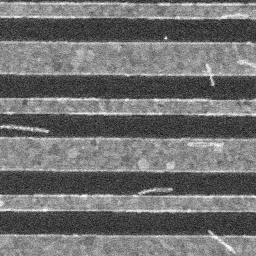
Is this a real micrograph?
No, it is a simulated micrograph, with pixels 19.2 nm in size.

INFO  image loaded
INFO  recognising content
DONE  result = lines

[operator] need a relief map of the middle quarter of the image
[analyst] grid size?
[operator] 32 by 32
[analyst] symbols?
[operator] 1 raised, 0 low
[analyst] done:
11111111111111111111111111111111
11111111111111111111111111111111
11111111111111111111111111111111
00000000000000000000000000000000
00000000000000000000000000000000
00000000000000000000000000000000
00000000000000000000000000000000
00000000000000000000000000000000
00000000000000000000000000000000
11111111111111111111111111111111
11111111111111111111111111111111
11111111111111111111111111111111
00000000000000000000000000000000
00000000000000000000000000000000
00000000000000000000000000000000
00000000000000000000000000000000
00000000000000000000000000000000
00000000000000000000000000000000
00000000100000000000000000000000
11111111111111111111111111111111
11111111111111111111111111111111
11111111111111111111111111111111
11111111111111111111111111111111
11111111111111111111111111111111
11111111111111111111111111111111
11111111111111111111111111111111
11111111111111111111111111111111
00000000000000000000000000000000
00000000000000000000000000000000
00000000000000000000000000000000
00000000000000000000000000000000
00000000000000000000000000000000